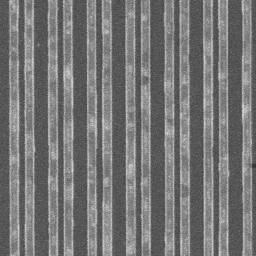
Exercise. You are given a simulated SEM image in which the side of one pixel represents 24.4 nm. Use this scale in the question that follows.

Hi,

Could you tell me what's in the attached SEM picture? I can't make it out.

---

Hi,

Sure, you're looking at parallel lines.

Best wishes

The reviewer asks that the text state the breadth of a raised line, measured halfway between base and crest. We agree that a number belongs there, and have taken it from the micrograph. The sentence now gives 7.88 pixels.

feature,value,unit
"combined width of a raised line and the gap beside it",474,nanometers